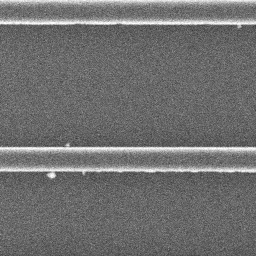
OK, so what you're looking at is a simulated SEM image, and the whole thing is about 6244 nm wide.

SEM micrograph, lines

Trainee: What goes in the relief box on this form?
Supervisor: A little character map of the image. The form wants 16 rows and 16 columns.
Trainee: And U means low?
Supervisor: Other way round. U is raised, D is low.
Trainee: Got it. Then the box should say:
UUUUUUUUUUUUUUUU
DDDDDDDDDDDDDDDD
DDDDDDDDDDDDDDDD
DDDDDDDDDDDDDDDD
DDDDDDDDDDDDDDDD
DDDDDDDDDDDDDDDD
DDDDDDDDDDDDDDDD
DDDDDDDDDDDDDDDD
DDDDDDDDDDDDDDDD
UUUUUUUUUUUUUUUU
UUUUUUUUUUUUUUUU
DDDDDDDDDDDDDDDD
DDDDDDDDDDDDDDDD
DDDDDDDDDDDDDDDD
DDDDDDDDDDDDDDDD
DDDDDDDDDDDDDDDD